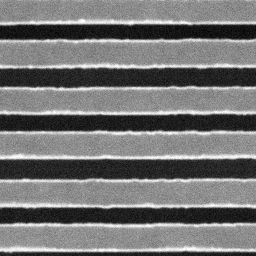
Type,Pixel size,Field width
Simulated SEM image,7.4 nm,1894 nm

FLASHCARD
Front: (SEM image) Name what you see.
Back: lines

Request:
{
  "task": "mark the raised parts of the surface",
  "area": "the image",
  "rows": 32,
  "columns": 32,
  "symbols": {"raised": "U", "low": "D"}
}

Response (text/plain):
UUUUUUUUUUUUUUUUUUUUUUUUUUUUUUUU
UUUUUUUUUUUUUUUUUUUUUUUUUUUUUUUU
UUUUUUUUUUUUUUUUUUUUUUUUUUUUUUUU
DDDDDDDDDDDDDDDDDDDDDDDDDDDDDDDD
DDDDDDDDDDDDDDDDDDDDDDDDDDDDDDDD
UUUUUUUUUUUUUUUUUUUUUUUUUUUUUUUU
UUUUUUUUUUUUUUUUUUUUUUUUUUUUUUUU
UUUUUUUUUUUUUUUUUUUUUUUUUUUUUUUU
DDDDDDDDDDDDDDDDDDDDDDDDDDDDDDDD
DDDDDDDDDDDDDDDDDDDDDDDDDDDDDDDD
DDDDDDDDDDDDDDDDDDDDDDDDDDDDDDDD
UUUUUUUUUUUUUUUUUUUUUUUUUUUUUUUU
UUUUUUUUUUUUUUUUUUUUUUUUUUUUUUUU
UUUUUUUUUUUUUUUUUUUUUUUUUUUUUUUU
DDDDDDDDDDDDDDDDDDDDDDDDDDDDDDDD
DDDDDDDDDDDDDDDDDDDDDDDDDDDDDDDD
UUUDUUUUUUUUUUDUUUUUUUUUUDUUUUUU
UUUUUUUUUUUUUUUUUUUUUUUUUUUUUUUU
UUUUUUUUUUUUUUUUUUUUUUUUUUUUUUUU
UUUUUUUUUUUUUUUUUUUUUUUUUUUUUUUU
DDDDDDDDDDDDDDDDDDDDDDDDDDDDDDDD
DDDDDDDDDDDDDDDDDDDDDDDDDDDDDDDD
DDDDDDDDDDDDDDDDDDDDDDDDDUUDUUDD
UUUUUUUUUUUUUUUUUUUUUUUUUUUUUUUU
UUUUUUUUUUUUUUUUUUUUUUUUUUUUUUUU
UUUUUUUUUUUUUUUUUUUUUUUUUUUUUUUU
DDDDDDDDDDDDDDDDDDDDDDDDDDDDDDDD
DDDDDDDDDDDDDDDDDDDDDDDDDDDDDDDD
UUUUUUUUUUUUUUUUUUUUUUUUUUUUUUUU
UUUUUUUUUUUUUUUUUUUUUUUUUUUUUUUU
UUUUUUUUUUUUUUUUUUUUUUUUUUUUUUUU
DUDDDDDDDDDDDDDDDDDDDDDDDDDDDDDD